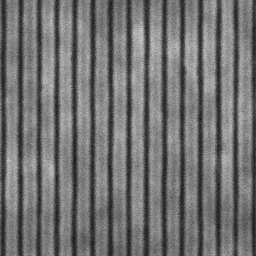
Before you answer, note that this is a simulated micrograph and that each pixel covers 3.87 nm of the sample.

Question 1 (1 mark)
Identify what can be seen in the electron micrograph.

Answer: parallel lines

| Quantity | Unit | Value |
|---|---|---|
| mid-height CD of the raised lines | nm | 46.9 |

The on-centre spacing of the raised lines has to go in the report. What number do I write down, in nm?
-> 69.3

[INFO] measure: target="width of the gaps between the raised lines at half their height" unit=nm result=23.2